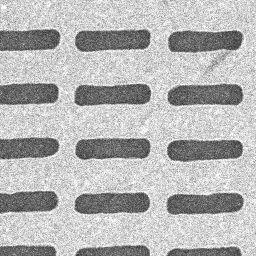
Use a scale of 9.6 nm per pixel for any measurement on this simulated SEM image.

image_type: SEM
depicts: a regular array of holes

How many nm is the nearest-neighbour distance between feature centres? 516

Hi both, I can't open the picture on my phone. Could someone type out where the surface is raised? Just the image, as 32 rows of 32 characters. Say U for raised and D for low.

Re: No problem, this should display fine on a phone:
UUUUUUUUUUUUUUUUUUUUUUUUUUUUUUUU
UUUUUUUUUUUUUUUUUUUUUUUUUUUUUUUU
UUUUUUUUUUUUUUUUUUUUUUUUUUUUUUUU
UUUUUUUUUUUUUUUUUUUUUUUUUUUUUUUU
DDDDDDDUUUDDDDDDDDDUUDDDDDDDDDUU
DDDDDDDUUDDDDDDDDDDUUDDDDDDDDDUU
UUUUUUUUUUUUUUUUUUUUUUDDDDUUUUUU
UUUUUUUUUUUUUUUUUUUUUUUUUUUUUUUU
UUUUUUUUUUUUUUUUUUUUUUUUUUUUUUUU
UUUUUUUUUUUUUUUUUUUUUUUUUUUUUUUU
UUDDDDDUUUUUUUUUDDUUUUUUUUUDDUUU
DDDDDDDUUDDDDDDDDDDUUDDDDDDDDDUU
DDDDDDDUUDDDDDDDDDDUUDDDDDDDDDUU
UUUUUUUUUUUUUUUUUUUUUUUUUUUUUUUU
UUUUUUUUUUUUUUUUUUUUUUUUUUUUUUUU
UUUUUUUUUUUUUUUUUUUUUUUUUUUUUUUU
UUUUUUUUUUUUUUUUUUUUUUUUUUUUUUUU
DDDDDDDUUUDDDDDDDDUUUUDUDUUUDUUU
DDDDDDDUUDDDDDDDDDDUUDDDDDDDDDUU
DDDDDDUUUUDDDDDDDDUUUDDDDDDDDDUU
UUUUUUUUUUUUUUUUUUUUUUUUUUUUUUUU
UUUUUUUUUUUUUUUUUUUUUUUUUUUUUUUU
UUUUUUUUUUUUUUUUUUUUUUUUUUUUUUUU
UUUUUUUUUUUUUUUUUUUUUUUUUUUUUUUU
DDDDDDDUUUDDDDDDDDDUUDDDDDDDDDUU
DDDDDDDUUDDDDDDDDDDUUDDDDDDDDDUU
DDDDDDUUUUDDDDDDDDUUUDDDDDDDDDUU
UUUUUUUUUUUUUUUUUUUUUUUUUUUUUUUU
UUUUUUUUUUUUUUUUUUUUUUUUUUUUUUUU
UUUUUUUUUUUUUUUUUUUUUUUUUUUUUUUU
UUUUUUUUUUUUUUUUUUUUUUUUUUUUUUUU
DDDDDDDUUUDDDDDDDDDUUDDDDDDDDDUU